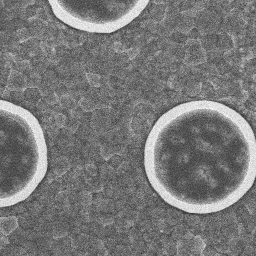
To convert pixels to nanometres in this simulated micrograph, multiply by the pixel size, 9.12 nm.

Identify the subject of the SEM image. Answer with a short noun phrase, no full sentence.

raised bodies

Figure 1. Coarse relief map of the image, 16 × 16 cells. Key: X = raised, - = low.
----XXXXX-------
-----XXX--------
----------------
----------------
----------------
----------------
----------------
XX--------XXXXX-
XX--------XXXXXX
XXX------XXXXXXX
XXX------XXXXXXX
XX--------XXXXX-
X----------XXX--
----------------
----------------
----------------